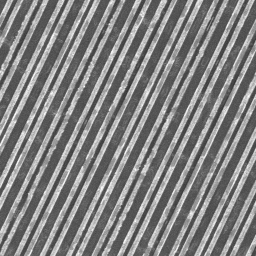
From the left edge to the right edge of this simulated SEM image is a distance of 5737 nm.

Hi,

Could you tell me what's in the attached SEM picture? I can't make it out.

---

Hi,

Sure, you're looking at parallel lines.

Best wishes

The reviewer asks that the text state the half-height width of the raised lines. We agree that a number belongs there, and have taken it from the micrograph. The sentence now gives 85.9 nm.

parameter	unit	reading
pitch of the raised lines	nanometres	259